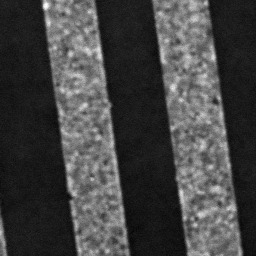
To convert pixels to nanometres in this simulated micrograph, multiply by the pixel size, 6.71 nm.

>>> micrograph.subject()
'one or a few lines or trenches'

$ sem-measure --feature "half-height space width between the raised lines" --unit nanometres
397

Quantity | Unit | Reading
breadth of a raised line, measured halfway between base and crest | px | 52.2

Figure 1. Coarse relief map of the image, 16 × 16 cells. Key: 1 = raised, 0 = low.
0001110000111000
0001110000111000
0001110000111000
0001110000111000
0001111000111100
0001111000111100
0000111000111100
0000111000011100
0000111000011100
0000111000011100
0000111000011100
0000111000011110
0000111100011110
0000011100011110
0000011100001110
0000011100001110